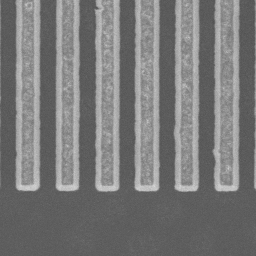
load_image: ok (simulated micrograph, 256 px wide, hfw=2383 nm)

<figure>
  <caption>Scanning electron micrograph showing parallel lines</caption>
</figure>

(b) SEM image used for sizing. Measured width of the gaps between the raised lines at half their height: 0.201 microns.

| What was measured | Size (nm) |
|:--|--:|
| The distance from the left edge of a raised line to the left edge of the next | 370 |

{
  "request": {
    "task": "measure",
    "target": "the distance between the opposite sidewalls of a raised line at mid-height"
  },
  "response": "173 nanometres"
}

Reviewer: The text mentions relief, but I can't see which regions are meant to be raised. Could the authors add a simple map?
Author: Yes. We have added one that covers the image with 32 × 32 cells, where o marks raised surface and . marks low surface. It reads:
..ooo..ooo..ooo..ooo..oo...oo...
..ooo..ooo..ooo..ooo..oo...ooo..
..ooo..ooo..ooo..ooo..oo...oo...
..ooo..oo...ooo..ooo..oo...oo...
..ooo..oo...ooo..ooo..oo...oo...
..ooo..ooo..ooo..ooo..oo...oo...
..ooo..ooo..ooo..ooo..oo...oo...
..ooo..oo...ooo..ooo..oo...oo...
..ooo..oo...ooo..ooo..oo...ooo..
..ooo..oo...oo...ooo..oo...ooo..
..ooo..oo...ooo..ooo..oo...oo...
..ooo..ooo..ooo..ooo..oo...ooo..
..ooo..ooo..ooo..ooo..oo...ooo..
..ooo..oo...oo...ooo..oo...oo...
..ooo..ooo..oo...ooo..oo...oo...
..ooo..ooo..oo...ooo..oo...oo...
..ooo..oo...oo...ooo..oo...ooo..
..ooo..oo...oo...ooo..oo...ooo..
..ooo..oo...oo...ooo..oo...oo...
..ooo..oo...oo...ooo..oo...oo...
..ooo..ooo..oo...oo...oo...oo...
..ooo..ooo..oo...oo...ooo..oo...
..ooo..oo...oo...oo...oo...oo...
...o....o....o....o....o....o...
................................
................................
................................
................................
................................
................................
................................
................................